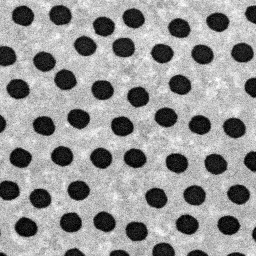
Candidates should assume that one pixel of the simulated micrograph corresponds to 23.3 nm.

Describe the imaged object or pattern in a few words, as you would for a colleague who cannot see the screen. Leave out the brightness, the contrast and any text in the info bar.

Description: a regular array of holes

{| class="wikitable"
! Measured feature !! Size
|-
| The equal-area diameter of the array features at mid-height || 502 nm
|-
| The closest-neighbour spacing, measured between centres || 0.783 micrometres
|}